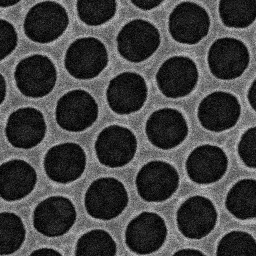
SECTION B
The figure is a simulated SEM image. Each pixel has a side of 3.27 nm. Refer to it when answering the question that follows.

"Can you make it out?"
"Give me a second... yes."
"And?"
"a regular array of holes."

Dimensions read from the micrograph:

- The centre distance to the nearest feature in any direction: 173 nanometres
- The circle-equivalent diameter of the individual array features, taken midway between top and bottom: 141 nm